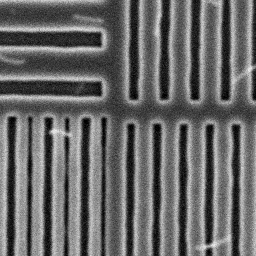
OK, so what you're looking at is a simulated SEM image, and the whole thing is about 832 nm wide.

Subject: groups of lines, slits or small figures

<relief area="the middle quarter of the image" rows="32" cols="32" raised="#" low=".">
################...#####..#####.
################...#####..#####.
################...#####..#####.
################...####....####.
..........######...####....####.
..........######...#####..#####.
..........######...#####..#####.
..........######...#####..#####.
################...#####..#####.
################################
################################
################################
################################
.###...##..#####################
..##...##..#####################
..##...##..#####..####...####..#
..##...##..#####..####...####..#
.###...##..#####..####...####..#
..##...##..#####..####...####..#
..##...##..#####..####...###...#
..##...##..#####..####...###...#
..##...##..#####..####...###...#
.###...##..####...####...####..#
.###...##..####...####...####..#
.###...##.#####...####...###...#
.###...##.#####...####..####...#
.###...##.#####...####..####...#
.###...##..####...####..####...#
.###...##..####...####..####...#
.###...##..####...####..####...#
.###...##..####...####..#####..#
.###...##..####...####...####..#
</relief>